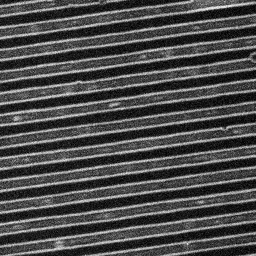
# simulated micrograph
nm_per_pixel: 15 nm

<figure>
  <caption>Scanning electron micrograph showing parallel lines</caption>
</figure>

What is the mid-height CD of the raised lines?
0.176 µm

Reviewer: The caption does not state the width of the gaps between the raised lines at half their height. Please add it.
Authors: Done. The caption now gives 0.149 micrometres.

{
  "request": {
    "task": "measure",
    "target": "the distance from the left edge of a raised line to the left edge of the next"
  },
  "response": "325 nm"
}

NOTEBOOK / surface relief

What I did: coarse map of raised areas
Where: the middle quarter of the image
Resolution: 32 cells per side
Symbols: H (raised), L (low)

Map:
LLLLLLLLLLLLLHHHHHHHHHHHHHHHHHHH
LLLLLLLHHHHHHHHHHHHHHHHHHHHLLLLL
HHHHHHHHHHHHHHHHHHLHLLLLLLLLLLLL
HHHHHHHHHHHHHLLLLLLLLLLLLLLLLLHH
HHHHHHLLLLLLLLLLLLLLLLLHHHHHHHHH
LLLLLLLLLLLLLLLLHHHHHHHHHHHHHHHH
LLLLLLLLLLHHHHHHHHHHHHHHHHHHHHLL
LHHHHHHHHHHHHHHHHHHHHHLLLLLLLLLL
HHHHHHHHHHHHHHHHLLLLLLLLLLLLLLLL
HHHHHHHHHLLLLLLLLLLLLLLLLLHHHHHH
HHLLLLLLLLLLLLLLLLLHHHHHHHHHHHHH
LLLLLLLLLLLLHHHHHHHHHHHHHHHHHHHH
LLLLLHHHHHHHHHHHHHHHHHHHHHLLLLLL
HHHHHHHHHHHHHHHHHHHLLLLLLLLLLLLL
HHHHHHHHHHHHLLLLLLLLLLLLLLLLLHHH
HHHHHLLLLLLLLLLLLLLLLLLLHHHHHHHH
LLLLLLLLLLLLLLLHHHHHHHHHHHHHHHHH
LLLLLLLLHHHHHHHHHHHHHHHHHHHHHHLL
HHHHHHHHHHHHHHHHHHHHHHLLLLLLLLLL
HHHHHHHHHHHHHHHLLLLLLLLLLLLLLLLL
HHHHHHHHLLLLLLLLLLLLLLLLLLHHHHHH
HLLLLLLLLLLLLLLLLLLLHHHHHHHHHHHH
LLLLLLLLLLLLLHHHHHHHHHHHHHHHHHHH
LLLLLHHHHHHHHHHHHHHHHHHHHLLLLLLL
HHHHHHHHHHHHHHHHHHLLLLLLLLLLLLLL
HHHHHHHHHHLLLLLLLLLLLLLLLLLLLLHH
HHHHLLLLLLLLLLLLLLLLLLHHHHHHHHHH
LLLLLLLLLLLLLLLLHHHHHHHHHHHHHHHH
LLLLLLLLHHHHHHHHHHHHHHHHHHHHHLLL
LHHHHHHHHHHHHHHHHHHHHLLLLLLLLLLL
HHHHHHHHHHHHHLLLLLLLLLLLLLLLLLLL
HHHHHHHLLLLLLLLLLLLLLLLLLLHHHHHH